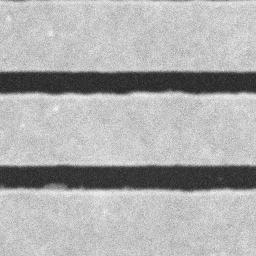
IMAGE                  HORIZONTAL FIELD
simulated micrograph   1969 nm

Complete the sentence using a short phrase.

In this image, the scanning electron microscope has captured lines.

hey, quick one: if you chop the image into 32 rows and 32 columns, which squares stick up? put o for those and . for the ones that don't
oooooooooooooooooooooooooooooooo
oooooooooooooooooooooooooooooooo
oooooooooooooooooooooooooooooooo
oooooooooooooooooooooooooooooooo
oooooooooooooooooooooooooooooooo
oooooooooooooooooooooooooooooooo
oooooooooooooooooooooooooooooooo
oooooooooooooooooooooooooooooooo
oooooooooooooooooooooooooooooooo
................................
................................
................................
oooooooooooooooooooooooooooooooo
oooooooooooooooooooooooooooooooo
oooooooooooooooooooooooooooooooo
oooooooooooooooooooooooooooooooo
oooooooooooooooooooooooooooooooo
oooooooooooooooooooooooooooooooo
oooooooooooooooooooooooooooooooo
oooooooooooooooooooooooooooooooo
oooooooooooooooooooooooooooooooo
................................
................................
................................
oooooooooooooooooooooooooooooooo
oooooooooooooooooooooooooooooooo
oooooooooooooooooooooooooooooooo
oooooooooooooooooooooooooooooooo
oooooooooooooooooooooooooooooooo
oooooooooooooooooooooooooooooooo
oooooooooooooooooooooooooooooooo
oooooooooooooooooooooooooooooooo